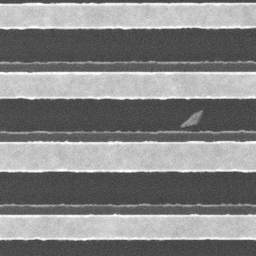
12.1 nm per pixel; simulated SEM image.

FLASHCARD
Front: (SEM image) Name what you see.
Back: lines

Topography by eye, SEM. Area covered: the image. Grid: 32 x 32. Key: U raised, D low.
DDUUUUUUUUUUUUUUUUUUUUUUUUUUUUUU
UUUUUUUUUUUUUUUUUUUUUUUUUUUUUUUU
UUUUUUUUUUUUUUUUUUUUUUUUUUUUUUUU
UUUDDDDDDDDDDDDUUDDDDDDDDDDDDDDD
DDDDDDDDDDDDDDDDDDDDDDDDDDDDDDDD
DDDDDDDDDDDDDDDDDDDDDDDDDDDDDDDD
DDDDDDDDDDDDDDDDDDDDDDDDDDDDDDDD
DDDDDDDDDDDDDDDDDDDDDDDDDDDDDDDD
DDDDDDDDDDDDDDDDDDDDDDDDDDDDDDDD
UUUUUUUUUUUUUUUUUUUUUUUUUUUUUUUU
UUUUUUUUUUUUUUUUUUUUUUUUUUUUUUUU
UUUUUUUUUUUUUUUUUUUUUUUUUUUUUUUU
DDDDDDDDDDDDDDDDDDDDDDDDDDDDDDDD
DDDDDDDDDDDDDDDDDDDDDDDDDDDDDDDD
DDDDDDDDDDDDDDDDDDDDDDDDDDDDDDDD
DDDDDDDDDDDDDDDDDDDDDDDDDDDDDDDD
DDDDDDDDDDDDDDDDDDDDDDDDDDDDDDDD
DDDDDDDDDDDDDDDDDDDDDDDDDDDDDDDD
UUUUUUUUUUUUUUUUUUUUUUUUUUUUUUUU
UUUUUUUUUUUUUUUUUUUUUUUUUUUUUUUU
UUUUUUUUUUUUUUUUUUUUUUUUUUUUUUUU
DDDDDDDDDDDDDDDDDDDDDDDDDDDDDDDD
DDDDDDDDDDDDDDDDDDDDDDDDDDDDDDDD
DDDDDDDDDDDDDDDDDDDDDDDDDDDDDDDD
DDDDDDDDDDDDDDDDDDDDDDDDDDDDDDDD
DDDDDDDDDDDDDDDDDDDDDDDDDDDDDDDD
DDDDDDDDDDDDDDDDDDDDDDDDDDDDDDDD
UUUUUUUUUUUUUUUUUUUUUUUUUUUUUUUU
UUUUUUUUUUUUUUUUUUUUUUUUUUUUUUUU
UUUUUUUUUUUUUUUUUUUUUUUUUUUUUUUU
DDDDDDDDDDDDDDDDDDDDDDDDDDDDDDDD
DDDDDDDDDDDDDDDDDDDDDDDDDDDDDDDD